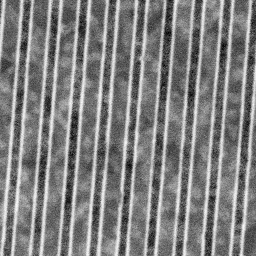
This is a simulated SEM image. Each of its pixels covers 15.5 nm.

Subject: parallel lines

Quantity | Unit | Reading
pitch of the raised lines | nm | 442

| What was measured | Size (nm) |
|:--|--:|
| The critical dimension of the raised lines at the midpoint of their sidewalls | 274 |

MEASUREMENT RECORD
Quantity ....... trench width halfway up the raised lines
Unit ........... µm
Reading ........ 0.166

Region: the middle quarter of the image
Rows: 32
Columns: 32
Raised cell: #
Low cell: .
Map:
##...#####..#####...####...####.
##...####...#####...####...####.
##...####...#####..#####...####.
##...####...####...#####..#####.
##...####...####...#####..#####.
##...####...####...####...#####.
##...####...####...####...####..
##...####...####...####...####..
##...####...####...####...####..
##..#####...####...####...####..
#...#####...####...####...####..
#...#####...####...####...####..
#...#####...####...####...####..
#...#####..#####...####...####..
#...#####..#####..#####...####..
#...####...#####..#####...####..
#...####...####...#####...####..
#...####...####...####....####..
#...####...####...####...#####..
#...####...####...####...#####..
#...####...####...####...####...
#...####...####...####...####...
#...####...####...####...####...
....####...####...####...####...
...####....####...####...####...
#..####....####...####...####...
...####....####...####...####...
...####...#####..#####...####...
...####...#####..#####...####...
...####...####...#####...####...
...####...####...####....####..#
...####...####...####...####...#